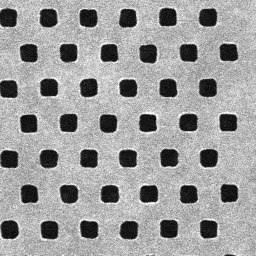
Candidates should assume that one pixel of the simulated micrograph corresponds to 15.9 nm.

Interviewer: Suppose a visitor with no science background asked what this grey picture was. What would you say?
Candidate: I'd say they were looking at a regular array of holes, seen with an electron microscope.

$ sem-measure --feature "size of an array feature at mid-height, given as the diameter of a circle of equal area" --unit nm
311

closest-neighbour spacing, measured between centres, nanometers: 630